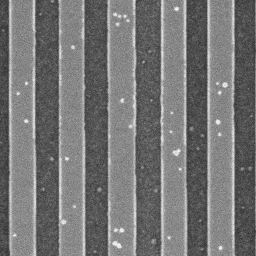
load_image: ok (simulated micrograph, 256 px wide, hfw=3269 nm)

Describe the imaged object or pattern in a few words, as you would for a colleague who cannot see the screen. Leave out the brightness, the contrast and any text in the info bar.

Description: lines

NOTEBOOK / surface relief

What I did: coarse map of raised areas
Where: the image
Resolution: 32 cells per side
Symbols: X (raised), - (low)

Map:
-XXX---XXX----XXX---XXX---XXX---
-XXX---XXX----XXX---XXX---XXX---
-XXX---XXX----XXX---XXX---XXX---
-XXX---XXX----XXX---XXX---XXX---
-XXX---XXX----XXX---XXX---XXX---
-XXX---XXX----XXX---XXX---XXX---
-XXX---XXX----XXX---XXX---XXX---
-XXX---XXX----XXX---XXX---XXX---
-XXX---XXX----XXX---XXX---XXX---
-XXX---XXX----XXX---XXX---XXX---
-XXX---XXX----XXX---XXX---XXX---
-XXX---XXX----XXX---XXX---XXX---
-XXX---XXX----XXX---XXX---XXX---
-XXX---XXX----XXX---XXX---XXX---
-XXX---XXX----XXX---XXX---XXX---
-XXX---XXX----XXX---XXX---XXX---
-XXX---XXX----XXX---XXX---XXX---
-XXX---XXXX---XXX---XXX---XXX---
-XXX---XXXX---XXX---XXX---XXX---
-XXX---XXXX---XXX---XXX---XXX---
-XXX---XXXX---XXX---XXX---XXX---
-XXX---XXXX---XXX---XXX---XXX---
-XXX---XXXX---XXX---XXX---XXX---
-XXX---XXXX---XXX---XXX---XXX---
-XXX---XXXX---XXX---XXX---XXX---
-XXX---XXXX---XXX---XXX---XXX---
-XXX---XXXX---XXX---XXX---XXX---
-XXX---XXXX---XXX---XXX---XXX---
-XXX---XXXX---XXX---XXX---XXX---
-XXX---XXXX---XXX---XXX---XXX---
-XXX---XXXX---XXX---XXX---XXX---
-XXX---XXXX---XXX---XXX---XXX---